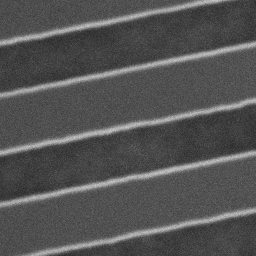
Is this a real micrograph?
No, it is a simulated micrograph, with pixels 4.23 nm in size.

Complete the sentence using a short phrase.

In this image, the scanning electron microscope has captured lines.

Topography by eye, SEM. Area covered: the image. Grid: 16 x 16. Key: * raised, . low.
***********.....
*******.........
*...............
............****
.......*********
..**************
***************.
***********.....
******..........
*...............
...........*****
......**********
.***************
***************.
**********......
*****...........